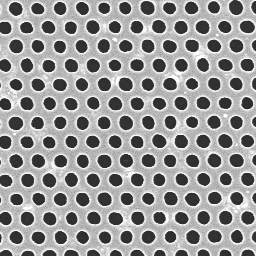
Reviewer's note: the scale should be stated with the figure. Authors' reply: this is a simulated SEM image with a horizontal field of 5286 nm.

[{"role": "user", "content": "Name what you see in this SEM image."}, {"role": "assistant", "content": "a regular array of holes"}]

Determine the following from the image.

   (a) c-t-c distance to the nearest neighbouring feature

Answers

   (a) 21.5 px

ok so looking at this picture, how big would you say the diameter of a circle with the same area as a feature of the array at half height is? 0.271 microns